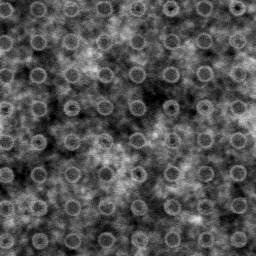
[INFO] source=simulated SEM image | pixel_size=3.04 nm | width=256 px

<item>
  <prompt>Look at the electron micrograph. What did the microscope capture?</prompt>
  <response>a regular array of raised bodies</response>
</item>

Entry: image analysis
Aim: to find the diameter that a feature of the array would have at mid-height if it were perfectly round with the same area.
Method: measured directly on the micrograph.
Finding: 0.0464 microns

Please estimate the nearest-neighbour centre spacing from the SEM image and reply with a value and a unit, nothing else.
99.3 nm